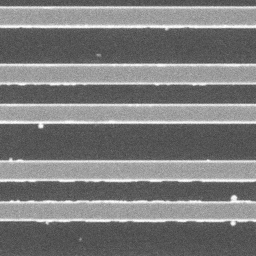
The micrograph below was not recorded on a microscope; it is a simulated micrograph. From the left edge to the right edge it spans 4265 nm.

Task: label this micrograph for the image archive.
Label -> lines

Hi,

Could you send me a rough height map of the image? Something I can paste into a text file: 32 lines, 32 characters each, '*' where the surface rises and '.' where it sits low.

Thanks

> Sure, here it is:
................................
********************************
********************************
................................
................................
................................
................................
................................
********************************
********************************
................................
................................
................................
********************************
********************************
................................
................................
................................
................................
................................
********************************
********************************
********************************
................................
................................
********************************
********************************
********************************
................................
................................
................................
................................